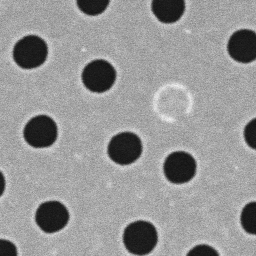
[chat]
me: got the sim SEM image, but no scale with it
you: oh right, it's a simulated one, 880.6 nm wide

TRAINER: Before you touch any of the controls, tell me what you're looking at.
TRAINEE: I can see holes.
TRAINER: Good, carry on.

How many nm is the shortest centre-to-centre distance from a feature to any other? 250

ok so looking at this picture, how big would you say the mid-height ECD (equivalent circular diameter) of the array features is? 33.8 pixels